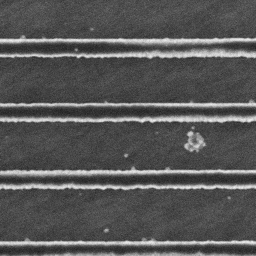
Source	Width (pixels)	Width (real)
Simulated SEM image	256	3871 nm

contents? lines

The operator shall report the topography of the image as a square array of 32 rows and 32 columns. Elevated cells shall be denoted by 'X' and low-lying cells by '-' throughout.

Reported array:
--------------------------------
--------------------------------
--------------------------------
--------------------------------
--------------------------------
XXXXXXXXXXXXXXXXXXXXXXXXXXXXXXXX
XXXXXXXXXXXXXXXXXXXXXXXXXXXXXXXX
--------------------------------
--------------------------------
--------------------------------
--------------------------------
--------------------------------
--------------------------------
XXXXXXXXXXXXXXXXXXXXXXXXXXXXXXXX
XXXXXXXXXXXXXXXXXXXXXXXXXXXXXXXX
--------------------------------
--------------------------------
--------------------------------
--------------------------------
--------------------------------
--------------------------------
XXXXXXXXXXXXXXXXXXXXXXXXXXXXXXXX
XXXXXXXXXXXXXXXXXXXXXXXXXXXXXXXX
XXXX-XXX-XXXX-XXX--XX-XX-XX-XXXX
--------------------------------
--------------------------------
--------------------------------
--------------------------------
--------------------------------
--------------------------------
XXXXXXXXXXXXXXXXXXXXXXXXXXXXXXXX
XXXXXXXXXXXXXXXXXXXXXXXXXXXXXXXX